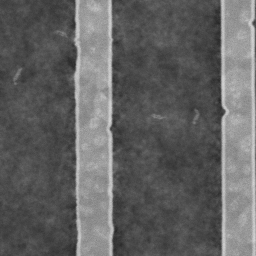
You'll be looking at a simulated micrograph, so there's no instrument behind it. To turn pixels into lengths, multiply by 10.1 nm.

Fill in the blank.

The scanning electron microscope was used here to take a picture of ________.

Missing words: one or a few lines or trenches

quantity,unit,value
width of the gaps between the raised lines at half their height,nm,1150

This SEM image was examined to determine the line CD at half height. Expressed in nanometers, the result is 306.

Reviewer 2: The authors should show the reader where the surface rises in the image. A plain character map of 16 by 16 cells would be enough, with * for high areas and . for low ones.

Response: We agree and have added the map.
.....**.......**
.....**.......**
.....**.......**
.....**.......**
.....**.......**
.....**.......**
.....**.......**
.....**.......**
.....**.......**
.....**.......**
.....**.......**
.....**.......**
.....**.......**
.....**.......**
.....**.......**
.....**.......**